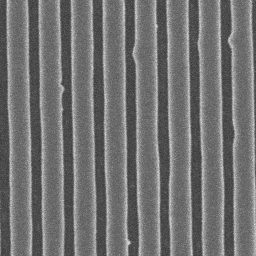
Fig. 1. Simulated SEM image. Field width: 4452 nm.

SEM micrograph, parallel lines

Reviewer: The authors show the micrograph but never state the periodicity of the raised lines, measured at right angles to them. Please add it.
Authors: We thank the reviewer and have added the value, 556 nanometres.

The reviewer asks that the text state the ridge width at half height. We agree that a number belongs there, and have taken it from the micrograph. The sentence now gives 0.361 um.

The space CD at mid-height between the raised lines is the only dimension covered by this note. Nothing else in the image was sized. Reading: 196 nm